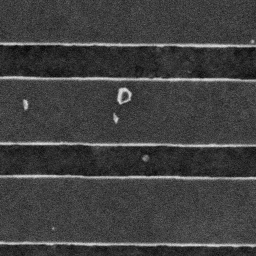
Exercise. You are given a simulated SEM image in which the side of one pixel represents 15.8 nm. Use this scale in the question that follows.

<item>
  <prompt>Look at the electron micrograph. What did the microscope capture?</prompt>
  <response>lines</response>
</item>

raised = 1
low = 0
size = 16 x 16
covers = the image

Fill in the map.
1111111111111111
1111111111111111
1111111111111111
0000000000000000
0000000000000000
1111111111111111
1111111111111111
1111111111111111
1111111111111111
0000000000000000
0000000000000000
1111111111111111
1111111111111111
1111111111111111
1111111111111111
0000000000000000